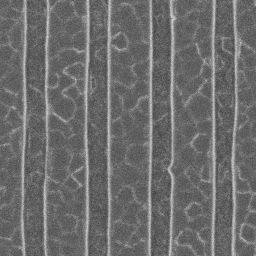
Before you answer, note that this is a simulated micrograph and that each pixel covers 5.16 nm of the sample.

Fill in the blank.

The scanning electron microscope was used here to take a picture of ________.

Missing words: one or a few lines or trenches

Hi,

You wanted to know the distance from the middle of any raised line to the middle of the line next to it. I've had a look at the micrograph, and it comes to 325 nm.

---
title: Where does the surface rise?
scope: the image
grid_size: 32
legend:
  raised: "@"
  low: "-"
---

@@@---@@@@@---@@@@@--@@@@@@--@@@
@@@---@@@@@---@@@@@--@@@@@@--@@@
@@@---@@@@@---@@@@@--@@@@@@--@@@
@@@---@@@@@---@@@@@--@@@@@@--@@@
@@@---@@@@@---@@@@@---@@@@@--@@@
@@@---@@@@@---@@@@@---@@@@@---@@
@@@---@@@@@---@@@@@---@@@@@---@@
@@@---@@@@@---@@@@@---@@@@@---@@
@@@---@@@@@---@@@@@---@@@@@--@@@
@@@---@@@@@---@@@@@---@@@@@--@@@
@@@---@@@@@---@@@@@--@@@@@@--@@@
@@@---@@@@@---@@@@@--@@@@@@--@@@
@@@---@@@@@---@@@@@--@@@@@@---@@
@@@---@@@@@---@@@@@---@@@@@--@@@
@@@---@@@@@---@@@@@---@@@@@--@@@
@@@---@@@@@---@@@@@---@@@@@--@@@
@@@---@@@@@---@@@@@---@@@@@--@@@
@@@---@@@@@---@@@@@---@@@@@--@@@
@@@---@@@@@---@@@@@---@@@@@--@@@
@@@---@@@@@---@@@@@---@@@@@--@@@
@@@---@@@@@---@@@@@--@@@@@@--@@@
@@@---@@@@@---@@@@@--@@@@@@--@@@
@@@---@@@@@---@@@@@---@@@@@--@@@
@@@---@@@@@---@@@@@---@@@@@--@@@
@@@---@@@@@---@@@@@---@@@@@--@@@
@@@---@@@@@---@@@@@---@@@@@--@@@
@@@---@@@@@---@@@@@--@@@@@@--@@@
@@@---@@@@@---@@@@@--@@@@@@--@@@
@@@---@@@@@---@@@@@--@@@@@@--@@@
@@@---@@@@@---@@@@@--@@@@@@--@@@
@@@---@@@@@---@@@@@--@@@@@@--@@@
@@@---@@@@@---@@@@@--@@@@@@--@@@